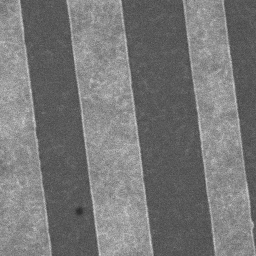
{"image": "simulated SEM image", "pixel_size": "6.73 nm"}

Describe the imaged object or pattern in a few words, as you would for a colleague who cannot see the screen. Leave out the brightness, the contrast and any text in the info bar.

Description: one or a few lines or trenches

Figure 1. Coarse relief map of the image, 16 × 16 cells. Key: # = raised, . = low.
#...####....##..
#...####....##..
#....###....##..
##...###....##..
##...###....###.
##...###....###.
##...###....###.
##...###....###.
##...####....##.
##...####....##.
###...###....##.
###...###....##.
###...###....###
###...###....###
###...###....###
###...###....###